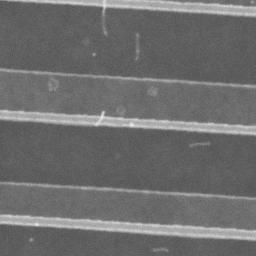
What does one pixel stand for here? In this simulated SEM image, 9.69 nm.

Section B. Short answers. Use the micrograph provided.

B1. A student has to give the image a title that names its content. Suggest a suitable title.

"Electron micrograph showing lines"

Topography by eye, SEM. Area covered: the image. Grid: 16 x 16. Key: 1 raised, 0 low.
0000000011111111
0000000000000000
0000000000000000
0000000000000000
1100000000000000
1111111111111111
1111111111111111
0111111111111111
0000000000000000
0000000000000000
0000000000000000
1000000000000000
1111111111111111
1111111111111111
0000000011111111
0000000000000000